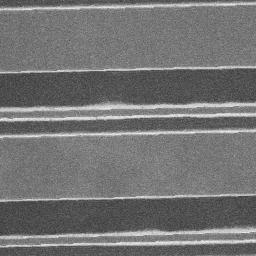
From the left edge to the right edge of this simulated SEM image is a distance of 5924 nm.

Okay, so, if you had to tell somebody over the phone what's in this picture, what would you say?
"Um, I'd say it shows lines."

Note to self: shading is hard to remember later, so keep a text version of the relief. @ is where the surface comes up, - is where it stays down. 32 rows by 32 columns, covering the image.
@@@@@@@@@@@@@@@@@@@@@@@@@@@@@@@@
@@@@@@@@@@@@@@@@@@@@@@@@@@@@@@@@
@@@@@@@@@@@@@@@@@@@@@@@@@@@@@@@@
@@@@@@@@@@@@@@@@@@@@@@@@@@@@@@@@
@@@@@@@@@@@@@@@@@@@@@@@@@@@@@@@@
@@@@@@@@@@@@@@@@@@@@@@@@@@@@@@@@
@@@@@@@@@@@@@@@@@@@@@@@@@@@@@@@@
@@@@@@@@@@@@@@@@@@@@@@@@@@@@@@@@
@@@@@@@@@@@@@@@@@@@@@@----------
--------------------------------
--------------------------------
--------------------------------
--------------------------------
----------------@@@@@@@@@@@@@@@@
@@@@@@@@@@@@@@@@@@@@@@@@@@@@@@@@
@@@@@@@@@@@@@@@@@@@@@@@@@@@@@@@@
@@@@@@@@@@@@@@@@@@@@@@@@@@@@@@@@
@@@@@@@@@@@@@@@@@@@@@@@@@@@@@@@@
@@@@@@@@@@@@@@@@@@@@@@@@@@@@@@@@
@@@@@@@@@@@@@@@@@@@@@@@@@@@@@@@@
@@@@@@@@@@@@@@@@@@@@@@@@@@@@@@@@
@@@@@@@@@@@@@@@@@@@@@@@@@@@@@@@@
@@@@@@@@@@@@@@@@@@@@@@@@@@@@@@@@
@@@@@@@@@@@@@@@@@@@@@@@@@@@@@@@@
@@@@@@@@@@@@@@@@@@@@@@@---------
--------------------------------
--------------------------------
--------------------------------
--------------------------------
-----------@@@@@@@@@@@@@@@@@@@@@
@@@@@@@@@@@@@@@@@@@@@@@@@@@@@@@@
@@@@@@@@@@@@@@@@@@@@@@@@@@@@@@@@